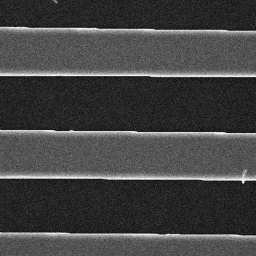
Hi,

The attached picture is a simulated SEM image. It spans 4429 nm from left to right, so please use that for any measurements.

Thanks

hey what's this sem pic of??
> lines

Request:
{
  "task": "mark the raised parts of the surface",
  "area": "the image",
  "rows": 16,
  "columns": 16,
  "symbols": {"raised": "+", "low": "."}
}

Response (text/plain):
................
................
++++++++++++++++
++++++++++++++++
++++++++++++++++
................
................
................
++++++++++++++++
++++++++++++++++
++++++++++++++++
................
................
................
................
++++++++++++++++